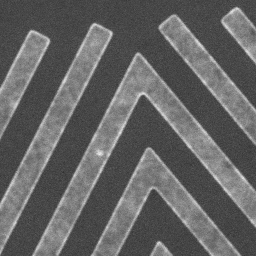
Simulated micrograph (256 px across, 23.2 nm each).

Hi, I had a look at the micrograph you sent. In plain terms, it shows groups of lines, slits or small figures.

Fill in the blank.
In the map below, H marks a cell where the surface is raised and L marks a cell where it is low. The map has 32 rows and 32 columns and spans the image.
LLLLLLLLLLLLLLLLLLLLLLLLLLLLLLLL
LLLLLLLLLLLLLLLLLLLLLLLLLLLLLHLL
LLLLLLLLLLLLLLLLLLLLLHHLLLLLHHHL
LLLLLLLLLLLHHLLLLLLLHHHLLLLLHHHH
LLLHHLLLLLLHHHLLLLLLLHHHLLLLLHHH
LLLHHHLLLLHHHLLLLLLLLHHHHLLLLLHH
LLHHHHLLLLHHHLLLLLLLLLHHHHLLLLLH
LLHHHLLLLHHHLLLLLHLLLLLHHHHLLLLL
LHHHHLLLLHHHLLLLHHHLLLLLHHHHLLLL
LHHHLLLLHHHLLLLLHHHHLLLLLHHHLLLL
HHHHLLLLHHHLLLLHHHHHHLLLLLHHHLLL
HHHLLLLHHHLLLLLHHHHHHHLLLLHHHHLL
HHLLLLLHHHLLLLHHHLLHHHLLLLLHHHHL
HHLLLLHHHLLLLLHHHLLLHHHLLLLLHHHH
HLLLLLHHHLLLLHHHLLLLHHHHLLLLLHHH
HLLLLHHHLLLLLHHHLLLLLHHHHLLLLLHH
LLLLLHHHLLLLHHHLLLLLLLHHHHLLLLLH
LLLLHHHLLLLHHHHLLLLLLLLHHHHLLLLH
LLLLHHHLLLLHHHLLLLLLLLLLHHHLLLLL
LLLHHHLLLLHHHHLLLLHHLLLLLHHHLLLL
LLLHHHLLLLHHHLLLLHHHLLLLLHHHHLLL
LLHHHLLLLHHHHLLLLHHHHLLLLLHHHHLL
LLHHHLLLLHHHLLLLHHHHHHLLLLLHHHHL
LHHHLLLLHHHHLLLLHHHHHHHLLLLLHHHH
LHHHLLLLHHHLLLLHHHLLHHHHLLLLLHHH
HHHLLLLHHHHLLLLHHHLLLHHHHLLLLLHH
HHHLLLLHHHLLLLHHHLLLLLHHHHLLLLHH
HHLLLLHHHHLLLLHHHLLLLLLHHHLLLLLH
HHLLLLHHHLLLLHHHLLLLLLLLHHHLLLLL
HLLLLHHHLLLLLHHHLLLLLLLLHHHHLLLL
HLLLLHHHLLLLHHHLLLLLLLLLLHHHHLLL
LLLLHHHLLLLLHHHLLLLHHLLLLLHHHHLL